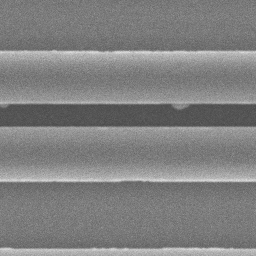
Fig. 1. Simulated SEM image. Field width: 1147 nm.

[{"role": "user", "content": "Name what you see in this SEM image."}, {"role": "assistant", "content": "lines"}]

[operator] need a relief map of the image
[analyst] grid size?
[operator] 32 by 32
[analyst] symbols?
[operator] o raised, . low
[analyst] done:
................................
................................
................................
................................
................................
................................
ooooooooooooo.oooooooooooooooooo
oooooooooooooooooooooooooooooooo
oooooooooooooooooooooooooooooooo
oooooooooooooooooooooooooooooooo
oooooooooooooooooooooooooooooooo
oooooooooooooooooooooooooooooooo
oooooooooooooooooooooooooooooooo
................................
................................
................................
oooooooooooooooooooooooooooooooo
oooooooooooooooooooooooooooooooo
oooooooooooooooooooooooooooooooo
oooooooooooooooooooooooooooooooo
oooooooooooooooooooooooooooooooo
oooooooooooooooooooooooooooooooo
oooooooooooooooooooooooooooooooo
................................
................................
................................
................................
................................
................................
................................
................................
oooooooooooooooooooooooooooooooo